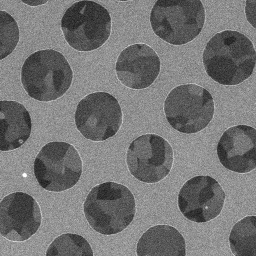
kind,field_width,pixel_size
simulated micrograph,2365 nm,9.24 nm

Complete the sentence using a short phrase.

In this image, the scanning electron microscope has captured a regular array of raised bodies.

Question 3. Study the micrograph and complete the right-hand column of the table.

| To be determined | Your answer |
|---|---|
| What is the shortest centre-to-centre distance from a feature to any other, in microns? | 0.589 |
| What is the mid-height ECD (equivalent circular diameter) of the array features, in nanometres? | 463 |